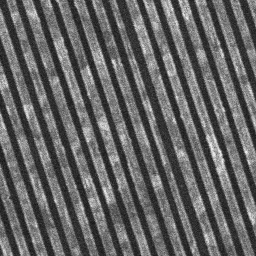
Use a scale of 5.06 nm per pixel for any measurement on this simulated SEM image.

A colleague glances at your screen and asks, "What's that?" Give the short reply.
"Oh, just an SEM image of parallel lines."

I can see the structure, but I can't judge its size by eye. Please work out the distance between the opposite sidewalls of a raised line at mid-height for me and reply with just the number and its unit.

43.9 nanometers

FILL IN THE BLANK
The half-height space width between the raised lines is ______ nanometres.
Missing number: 39.1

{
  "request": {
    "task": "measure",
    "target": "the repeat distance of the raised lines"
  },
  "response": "82.9 nm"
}